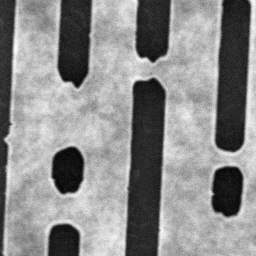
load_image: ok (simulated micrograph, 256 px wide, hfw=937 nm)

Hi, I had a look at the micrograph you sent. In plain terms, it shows one or a few lines or trenches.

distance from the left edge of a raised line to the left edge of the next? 283 nanometers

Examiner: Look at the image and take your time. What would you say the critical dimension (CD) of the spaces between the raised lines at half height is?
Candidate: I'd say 0.126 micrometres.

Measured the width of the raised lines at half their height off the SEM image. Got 165 nanometres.